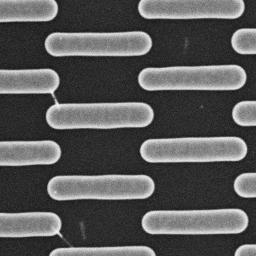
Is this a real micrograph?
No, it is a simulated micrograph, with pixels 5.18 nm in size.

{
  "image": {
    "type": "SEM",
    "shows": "groups of lines, slits or small figures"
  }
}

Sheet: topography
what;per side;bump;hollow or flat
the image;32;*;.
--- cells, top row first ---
*******..........*************..
*******..........*************..
******..........................
................................
......*************..........***
......*************..........***
......************............**
................................
.....................*********..
*******..........**************.
*******..........*************..
*******.........................
................................
......*************..........***
......*************..........***
......*************...........**
................................
...................***********..
*******...........*************.
*******...........************..
*****...........................
................................
......*************..........***
......*************..........***
......*************...........**
................................
...................***********..
*******...........*************.
*******...........*************.
****............................
................................
.......************..........***